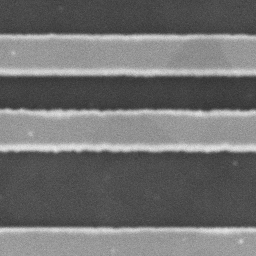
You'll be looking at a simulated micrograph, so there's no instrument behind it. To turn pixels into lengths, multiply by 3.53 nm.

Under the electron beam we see lines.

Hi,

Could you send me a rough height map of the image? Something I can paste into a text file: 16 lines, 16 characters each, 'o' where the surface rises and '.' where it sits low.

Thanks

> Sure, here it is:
................
................
oooooooooooooooo
oooooooooooooooo
oooooooooooooooo
................
................
oooooooooooooooo
oooooooooooooooo
................
................
................
................
................
oooooooooooooooo
oooooooooooooooo